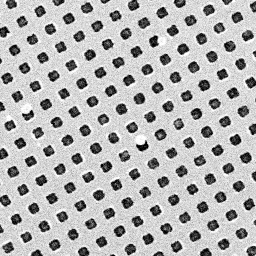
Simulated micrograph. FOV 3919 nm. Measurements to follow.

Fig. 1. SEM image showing a regular array of holes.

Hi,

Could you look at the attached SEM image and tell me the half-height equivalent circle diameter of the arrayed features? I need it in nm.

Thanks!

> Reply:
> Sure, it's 183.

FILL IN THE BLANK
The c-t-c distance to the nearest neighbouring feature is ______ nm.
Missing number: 317